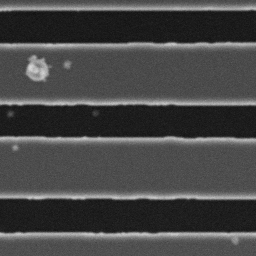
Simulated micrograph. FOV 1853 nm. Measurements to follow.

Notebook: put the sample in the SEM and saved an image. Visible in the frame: lines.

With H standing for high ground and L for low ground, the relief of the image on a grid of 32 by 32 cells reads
HHHHHHHHHHHHHHHHHHHHHHHHHHHHHHHH
LLLLLLLLLLLLLLLLLLLLLLLLLLLLLLLL
LLLLLLLLLLLLLLLLLLLLLLLLLLLLLLLL
LLLLLLLLLLLLLLLLLLLLLLLLLLLLLLLL
LLLLLLLLLLLLLLLLLLLLLLLLLLLLLLLL
LLLLLLLLLLLLLLLLHHHHHHLLHHHHHHHH
HHHHHHHHHHHHHHHHHHHHHHHHHHHHHHHH
HHHHHHHHHHHHHHHHHHHHHHHHHHHHHHHH
HHHHHHHHHHHHHHHHHHHHHHHHHHHHHHHH
HHHHHHHHHHHHHHHHHHHHHHHHHHHHHHHH
HHHHHHHHHHHHHHHHHHHHHHHHHHHHHHHH
HHHHHHHHHHHHHHHHHHHHHHHHHHHHHHHH
HHHHHHHHHHHHHHHHHHHHHHHHHHHHHHHH
LLLLLLLLLLLLLLLLLLLLLLLLLLLLLLLL
LLLLLLLLLLLLLLLLLLLLLLLLLLLLLLLL
LLLLLLLLLLLLLLLLLLLLLLLLLLLLLLLL
LLLLLLLLLLLLLLLLLLLLLLLLLLLLLLLL
HHHHHHHHHHHHHHHHHHHHHHHHHHHHHHHH
HHHHHHHHHHHHHHHHHHHHHHHHHHHHHHHH
HHHHHHHHHHHHHHHHHHHHHHHHHHHHHHHH
HHHHHHHHHHHHHHHHHHHHHHHHHHHHHHHH
HHHHHHHHHHHHHHHHHHHHHHHHHHHHHHHH
HHHHHHHHHHHHHHHHHHHHHHHHHHHHHHHH
HHHHHHHHHHHHHHHHHHHHHHHHHHHHHHHH
HHHHHHHHHHHHHHHHHHHHHHHHHHHHHHHH
LLLLLLLLLLLLLLLLLLLLLLLLLLLLLLLL
LLLLLLLLLLLLLLLLLLLLLLLLLLLLLLLL
LLLLLLLLLLLLLLLLLLLLLLLLLLLLLLLL
LLLLLLLLLLLLLLLLLLLLLLLLLLLLLLLL
HHHHHHHHHHHHHHHHHHHHHHHHHHHHHHHH
HHHHHHHHHHHHHHHHHHHHHHHHHHHHHHHH
HHHHHHHHHHHHHHHHHHHHHHHHHHHHHHHH